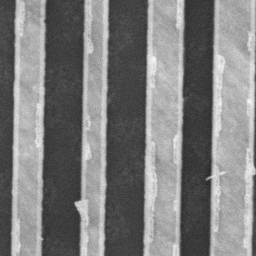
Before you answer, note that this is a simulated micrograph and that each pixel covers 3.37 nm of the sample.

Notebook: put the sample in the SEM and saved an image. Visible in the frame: one or a few lines or trenches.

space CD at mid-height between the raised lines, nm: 145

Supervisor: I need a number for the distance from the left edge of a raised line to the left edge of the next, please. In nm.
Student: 229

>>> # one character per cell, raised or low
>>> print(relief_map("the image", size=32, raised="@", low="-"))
--@@@------@@------@@@@----@@@@@
--@@@------@@------@@@@----@@@@@
--@@@------@@------@@@@----@@@@@
--@@@------@@------@@@@----@@@@@
--@@@------@@------@@@@----@@@@@
--@@@------@@------@@@@----@@@@@
--@@@------@@------@@@@----@@@@@
--@@@------@@------@@@@----@@@@@
--@@@------@@------@@@@----@@@@@
--@@@------@@------@@@@----@@@@@
--@@@------@@------@@@@----@@@@-
--@@@------@@------@@@@----@@@@-
--@@@------@@------@@@@----@@@@-
--@@@------@@------@@@@----@@@@-
--@@@------@@------@@@@----@@@@-
--@@@------@@------@@@@----@@@@-
--@@@------@@------@@@@----@@@@-
--@@@------@@------@@@@----@@@@-
--@@@------@@------@@@-----@@@@-
--@@@------@@------@@@-----@@@@-
--@@@------@@------@@@-----@@@@@
--@@@------@@------@@@-----@@@@@
--@@@-----@@@-----@@@@-----@@@@-
--@@@-----@@@-----@@@@-----@@@@-
--@@@-----@@@-----@@@@-----@@@@-
--@@@-----@@@-----@@@@-----@@@@-
--@@@-----@@@-----@@@@-----@@@@-
--@@@-----@@@-----@@@@-----@@@@-
--@@@-----@@@-----@@@@-----@@@@-
--@@@-----@@@-----@@@@-----@@@@-
--@@@-----@@@-----@@@@-----@@@@-
--@@@-----@@@-----@@@@-----@@@@-